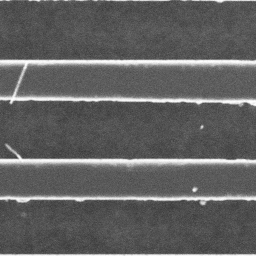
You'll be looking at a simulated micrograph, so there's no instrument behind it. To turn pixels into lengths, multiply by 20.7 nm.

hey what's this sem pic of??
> lines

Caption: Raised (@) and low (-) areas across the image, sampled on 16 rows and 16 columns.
----------------
----------------
----------------
----------------
@@@@@@@@@@@@@@@@
@@@@@@@@@@@@@@@@
----------------
----------------
----------------
----------------
@@@@@@@@@@@@@@@@
@@@@@@@@@@@@@@@@
----------------
----------------
----------------
----------------